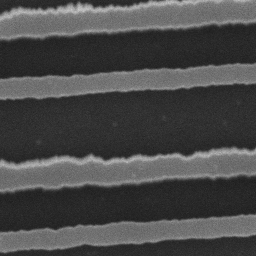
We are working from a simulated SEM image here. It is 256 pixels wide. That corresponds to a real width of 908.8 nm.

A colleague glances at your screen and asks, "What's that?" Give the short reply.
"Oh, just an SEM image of lines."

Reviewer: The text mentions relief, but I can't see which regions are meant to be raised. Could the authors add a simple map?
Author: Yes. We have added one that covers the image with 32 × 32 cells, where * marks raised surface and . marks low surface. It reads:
..................**************
..******************************
********************************
******************..............
**..*...........................
................................
................................
................................
........................********
.........***********************
*****************************...
*************...................
................................
................................
................................
................................
................................
................................
................................
....................***.********
*...****************************
********************************
*******************.............
***.............................
................................
................................
................................
........................********
........************************
*****************************.*.
***************.................
*...............................